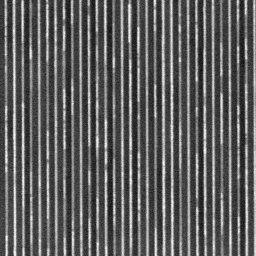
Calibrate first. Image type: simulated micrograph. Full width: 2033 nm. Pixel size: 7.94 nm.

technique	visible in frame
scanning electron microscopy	parallel lines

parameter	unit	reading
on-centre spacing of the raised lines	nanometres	65.7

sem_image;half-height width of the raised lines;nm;13.9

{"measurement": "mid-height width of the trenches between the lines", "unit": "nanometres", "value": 49.6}